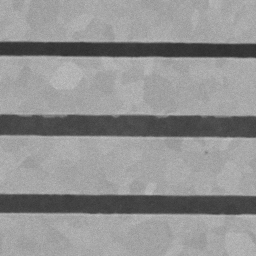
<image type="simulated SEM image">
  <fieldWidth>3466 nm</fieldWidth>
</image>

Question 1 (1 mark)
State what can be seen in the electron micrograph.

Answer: lines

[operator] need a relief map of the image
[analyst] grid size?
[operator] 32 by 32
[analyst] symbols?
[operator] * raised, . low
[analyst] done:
********************************
********************************
********************************
********************************
********************************
................................
................................
********************************
********************************
********************************
********************************
********************************
********************************
********************************
................................
................................
................................
********************************
********************************
********************************
********************************
********************************
********************************
********************************
................................
................................
................................
********************************
********************************
********************************
********************************
********************************